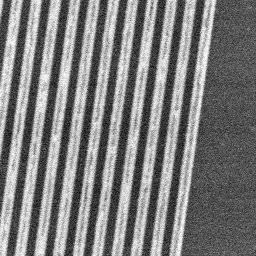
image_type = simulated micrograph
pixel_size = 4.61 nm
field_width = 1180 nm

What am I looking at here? parallel lines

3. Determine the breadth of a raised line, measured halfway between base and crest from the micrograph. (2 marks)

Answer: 35.9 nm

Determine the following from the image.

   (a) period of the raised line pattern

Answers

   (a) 0.0881 micrometres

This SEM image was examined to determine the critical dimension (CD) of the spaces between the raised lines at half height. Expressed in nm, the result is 51.9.